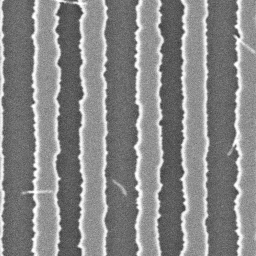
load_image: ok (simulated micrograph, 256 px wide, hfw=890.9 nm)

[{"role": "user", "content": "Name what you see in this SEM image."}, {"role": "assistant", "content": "lines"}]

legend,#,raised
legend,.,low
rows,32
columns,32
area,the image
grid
....####..###....###...###....##
....###...###....###...###....##
....###...###....###...###....##
....###...###....###...###....##
....###...###....###...###....##
....###...###....###...###....##
....###...###....###...###....##
....###...###....###...###....##
....###...###....###...###....##
....###...###....###...###....##
....###...###....###...###....##
....###...###....###...###....##
....###...###....###...###....##
....###...###....###...###...###
....###...###....###...###...###
....###...###....###...###...###
....###...###....###...###...###
....###...###....###...###...###
....###...###....###...###....##
....###...###....###...###....##
....###...###....###...###....##
....###...###....###...###....##
....###...###....###...###....##
....###...###....###...###....##
....###...###....###...###....##
....###...###....###...###...###
....###...###....###...###...###
....###...###....###...###....##
....###...###....###...###....##
....###...###....###...###....##
....###...###....###...###....##
....###...###....###...###....##